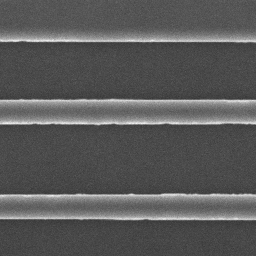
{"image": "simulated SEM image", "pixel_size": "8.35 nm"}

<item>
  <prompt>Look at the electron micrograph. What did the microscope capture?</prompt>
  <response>lines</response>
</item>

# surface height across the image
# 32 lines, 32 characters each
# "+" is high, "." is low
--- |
++++++++++++++++++++++++++++++++
++++++++++++++++++++++++++++++++
++++++++++++++++++++++++++++++++
++++++++++++++++++++++++++++++++
++++++++++++++++++++++++++++++++
................................
................................
................................
................................
................................
................................
................................
................................
++++++++++++++++++++++++++++++++
++++++++++++++++++++++++++++++++
................................
................................
................................
................................
................................
................................
................................
................................
................................
++++++++++++++++++++++++++++++++
++++++++++++++++++++++++++++++++
++++++++++++++++++++++++++++++++
................................
................................
................................
................................
................................